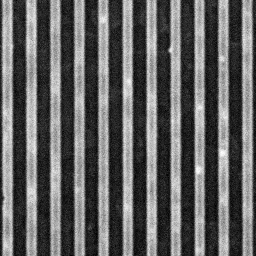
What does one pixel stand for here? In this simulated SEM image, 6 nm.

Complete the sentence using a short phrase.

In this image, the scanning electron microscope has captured parallel lines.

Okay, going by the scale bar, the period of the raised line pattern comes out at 144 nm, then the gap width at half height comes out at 90.7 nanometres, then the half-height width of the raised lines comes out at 53.2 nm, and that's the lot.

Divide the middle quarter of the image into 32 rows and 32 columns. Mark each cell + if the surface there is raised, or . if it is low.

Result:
...++....++....++....++....++...
...++....++....++....++....++...
...++....++....++....++....++...
...++....++....++....++....++...
...++....++....++....++....++...
...++....++....++....++....++...
...++....++....++....++....++...
...++....++....++....++....++...
...++....++....++....++....++...
...++....++....++....++....++...
...++....++....++....++....++...
...++....++....++....++....++...
...++....++....++....++....++...
...++....++....++....++....++...
...++....++....++....++....++...
...++....++....++....++....++...
...++....++....++....++....++...
...++....++....++....++....++...
...++....++....++....++....++...
...++....++....++....++....++...
...++....++....++....++....++...
...++....++....++....++....++...
...++....++....++....++....++...
...++....++....++....++....++...
...++....++....++....++....++...
...++....++....++....++....++...
...++....++....++....++....++...
...++....++....++....++....++...
...++....++....++....++....++...
...++....++....++....++....++...
...++....++....++....++....++...
...++....++....++....++....++...